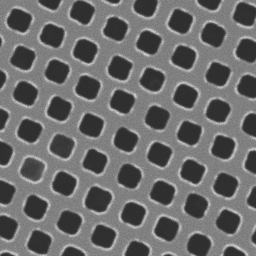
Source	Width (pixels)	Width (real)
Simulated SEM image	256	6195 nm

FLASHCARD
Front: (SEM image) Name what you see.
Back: a regular array of holes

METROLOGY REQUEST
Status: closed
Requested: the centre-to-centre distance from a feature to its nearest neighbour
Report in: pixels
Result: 35.9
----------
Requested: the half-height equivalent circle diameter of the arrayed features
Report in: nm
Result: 586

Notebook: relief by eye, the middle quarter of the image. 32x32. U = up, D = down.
DUUUUUUUUUUDDDDDDUUUUUUUUUUUDDDD
DDUUUUUUUUUDDDDDDUUUDDDUUUUUUUUU
DUUUUUUUUUUDDDDDUUUUDDDDDUUUUUUU
DUUUDDDUUUUUUDDDUUUDDDDDDUUUUUUU
UUUUDDDDDUUUUUUUUUUDDDDDDUUUUUUU
UUUDDDDDDUUUUUUUUUUUDDDDDUUUUDDD
UUUDDDDDDUUUUDUUUUUUUDDDUUUUDDDD
UUUDDDDDDUUUDDDDDUUUUUUUUUUDDDDD
UUUUUDDDUUUUDDDDDDUUUUUUUUUDDDDD
DUUUUUUUUUUUDDDDDDUUUUUUUUUUDDDD
DDUUUUUUUUUUDDDDDUUUUUDDUUUUUDDD
DDUUUUUUUUUUUDDDDUUUUDDDDDUUUUUU
DUUUUDDUUUUUUUUDUUUUUDDDDDDUUUUU
DUUUUDDDDUUUUUUUUUUUDDDDDDUUUUUU
UUUUDDDDDDUUUUUUUUUUDDDDDDUUUUDD
UUUUDDDDDDUUUUUUUUUUUDDDDDUUUDDD
UUUUDDDDDDUUUDDDUUUUUUUDUUUUUDDD
UUUUUDDDDUUUUDDDDDUUUUUUUUUUDDDD
DDUUUUUUUUUUUDDDDDDUUUUUUUUUDDDD
DDDUUUUUUUUUDDDDDDUUUUUUUUUUUDDD
DDDUUUUUUUUUUDDDDDUUUUDDDDUUUUUU
DDUUUUDDUUUUUUDDDUUUUDDDDDDUUUUU
DDUUUUDDDDUUUUUUUUUUUDDDDDDUUUUU
DUUUUDDDDDDUUUUUUUUUUDDDDDDUUUUU
UUUUUDDDDDDUUUUUUUUUUUDDDDUUUUDD
UUUUUDDDDDUUUUDDDDUUUUUDDDUUUUDD
UUUUUUDDDDUUUUDDDDDUUUUUUUUUUDDD
DUUUUUUUDUUUUDDDDDDUUUUUUUUUUDDD
DDDUUUUUUUUUUDDDDDDUUUUUUUUUUDDD
DDDUUUUUUUUUUDDDDDDUUUUDDDUUUUUD
DDDUUUUUDUUUUUUDDDUUUUDDDDDUUUUU
DDDUUUDDDDDUUUUUUUUUUUDDDDDDUUUU